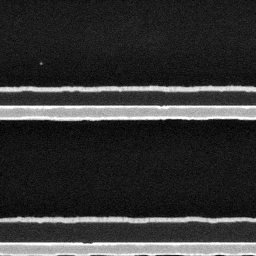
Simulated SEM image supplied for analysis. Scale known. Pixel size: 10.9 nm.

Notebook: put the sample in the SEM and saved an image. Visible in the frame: lines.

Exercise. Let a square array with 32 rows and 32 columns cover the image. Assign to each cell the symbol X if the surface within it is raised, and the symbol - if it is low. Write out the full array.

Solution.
--------------------------------
--------------------------------
--------------------------------
--------------------------------
--------------------------------
--------------------------------
--------------------------------
--------------------------------
--------------------------------
--------------------------------
--------------------------------
XXXXXXXXXXXXXXXXXXXXXXXXXXXXXXXX
XXXXXXXXXXXXXXXXXXXXXXXXXXXXXXXX
XXXXXXXXXXXXXXXXXXXXXXXXXXXXXXXX
XXXXXXXXXXXXXXXXXXXXXXXXXXXXXXXX
--------------------------------
--------------------------------
--------------------------------
--------------------------------
--------------------------------
--------------------------------
--------------------------------
--------------------------------
--------------------------------
--------------------------------
--------------------------------
--------------------------------
--X--------------------XX----XX-
XXXXXXXXXXXXXXXXXXXXXXXXXXXXXXXX
XXXXXXXXXXXXXXXXXXXXXXXXXXXXXXXX
XXXXXXXXXXXXXXXXXXXXXXXXXXXXXXXX
XXXXXXXXXXXXXXXXXXXXXXXXXXXXXXXX